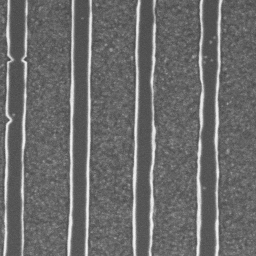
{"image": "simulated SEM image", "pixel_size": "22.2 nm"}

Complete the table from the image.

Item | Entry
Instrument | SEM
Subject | one or a few lines or trenches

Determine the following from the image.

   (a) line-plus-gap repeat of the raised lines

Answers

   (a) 1430 nm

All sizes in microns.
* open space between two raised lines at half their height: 1.05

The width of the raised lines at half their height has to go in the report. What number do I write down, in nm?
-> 391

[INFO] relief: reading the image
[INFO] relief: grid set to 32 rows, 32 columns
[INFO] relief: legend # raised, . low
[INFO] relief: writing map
.##......##......##......##.....
.##......##......##......##.....
.##......##......##......##.....
.##......##......##......##.....
.##......##......##......##.....
.##......##......##......##.....
.##......##......##......##.....
.##......##......##......##.....
.##......##......##......##.....
.##......##......##......##.....
.##......##......##......##.....
.##......##......##......##.....
.##......##......##......##.....
.##......##......##......##.....
.##......##......##......##.....
.##......##......##......##.....
.##......##......##......##.....
.##......##......##......##.....
.##......##......##......##.....
.##......##......##......##.....
.##......##......##......##.....
.##......##......##......##.....
.##......##......##......##.....
.##......##......##......##.....
.##......##......##......##.....
.##......##......##......##.....
.##......##......##......##.....
.##......##......##......##.....
.##......##......##......##.....
.##......##......##......##.....
.##......##......##......##.....
.##......##......##......##.....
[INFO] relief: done